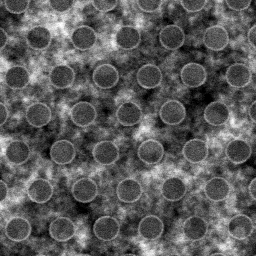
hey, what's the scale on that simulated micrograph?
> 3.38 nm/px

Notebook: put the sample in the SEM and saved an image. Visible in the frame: a regular array of raised bodies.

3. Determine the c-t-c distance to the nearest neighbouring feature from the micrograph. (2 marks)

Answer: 0.146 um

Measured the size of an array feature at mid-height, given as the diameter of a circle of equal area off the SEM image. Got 82.7 nm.